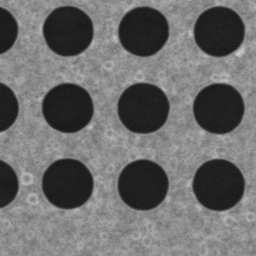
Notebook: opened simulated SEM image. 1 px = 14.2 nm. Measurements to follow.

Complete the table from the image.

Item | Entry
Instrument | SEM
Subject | a regular array of holes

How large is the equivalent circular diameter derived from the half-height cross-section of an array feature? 729 nm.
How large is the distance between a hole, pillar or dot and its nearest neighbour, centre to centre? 1070 nm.